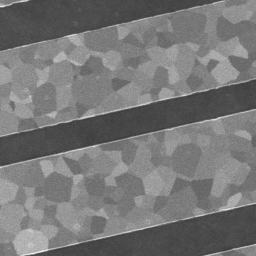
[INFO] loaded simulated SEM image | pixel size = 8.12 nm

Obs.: one or a few lines or trenches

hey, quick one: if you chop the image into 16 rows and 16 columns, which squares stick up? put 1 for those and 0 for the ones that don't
0000000000001111
0000000011111111
0001111111111111
1111111111111111
1111111111111111
1111111111111000
1111111110000000
1111100000000111
0000000001111111
0000111111111111
1111111111111111
1111111111111111
1111111111111111
1111111111110000
1111111100000000
1111000000000001